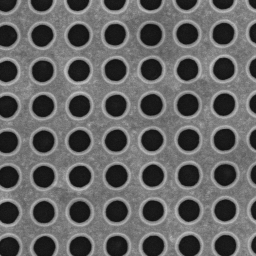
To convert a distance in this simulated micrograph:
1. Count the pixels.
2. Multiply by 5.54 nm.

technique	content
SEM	a regular array of holes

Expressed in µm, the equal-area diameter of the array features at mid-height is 0.135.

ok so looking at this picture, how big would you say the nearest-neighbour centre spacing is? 0.195 microns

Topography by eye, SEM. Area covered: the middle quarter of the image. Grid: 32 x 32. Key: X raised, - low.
X------XXX------XXX------XXX----
X------XXX------XXX------XXX----
X------XXX------XXX------XXX----
X-----XXXX-----XXXXX----XXXXX---
XXX-XXXXXXXX--XXXXXXXXXXXXXXXXXX
XXXXXXXXXXXXXXXXXXXXXXXXXXXXXXXX
XXXXXXXXXXXXXXXXXXXXXXXXXXXXXXXX
XXX--XXXXXXX--XXXXXXX--XXXXXX---
XX----XXXXX----XXXX------XXXX---
X------XXX------XXX------XXX----
X------XXX------XXX------XXX----
X------XXX------XXX------XXX----
X-----XXXXX----XXXXX----XXXXX---
XXX-XXXXXXXXXXXXXXXXXXXXXXXXXXXX
XXXXXXXXXXXXXXXXXXXXXXXXXXXXXXXX
XXXXXXXXXXXXXXXXXXXXXXXXXXXXXXXX
XXX--XXXXXXX---XXXXXX---XXXXX---
X-----XXXXX-----XXX------XXX----
X------XXX------XXX------XXX----
X------XXX------XXX------XXX----
X------XXX------XXX------XXXX---
XX----XXXXX----XXXXX----XXXXX---
XXXXXXXXXXXXXXXXXXXXXXXXXXXXXXXX
XXXXXXXXXXXXXXXXXXXXXXXXXXXXXXXX
XXXXXXXXXXXXXXXXXXXXXXXXXXXXXXXX
XXX--XXXXXX----XXXXXX---XXXXX---
X------XXXX-----XXXX-----XXXX---
X------XXX------XXX------XXX----
X------XXX------XXX------XXX----
X------XXX------XXX------XXXX---
XX----XXXXX----XXXXX----XXXXX---
XXXXXXXXXXXXXXXXXXXXXXXXXXXXXXXX